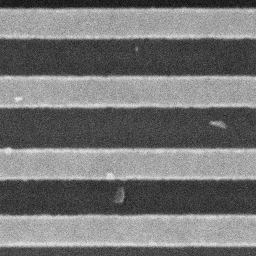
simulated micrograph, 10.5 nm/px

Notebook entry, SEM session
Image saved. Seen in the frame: lines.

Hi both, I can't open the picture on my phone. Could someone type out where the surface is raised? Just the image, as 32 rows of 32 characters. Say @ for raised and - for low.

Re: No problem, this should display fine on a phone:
--------------------------------
@@@@@@@@@@@@@@@@@@@@@@@@@@@@@@@@
@@@@@@@@@@@@@@@@@@@@@@@@@@@@@@@@
@@@@@@@@@@@@@@@@@@@@@@@@@@@@@@@@
@@@@@@@@@@@@@@@@@@@@@@@@@@@@@@@@
--------------------------------
--------------------------------
--------------------------------
--------------------------------
--------------------------------
@@@@@@@@@@@@@@@@@@@@@@@@@@@@@@@@
@@@@@@@@@@@@@@@@@@@@@@@@@@@@@@@@
@@@@@@@@@@@@@@@@@@@@@@@@@@@@@@@@
--------------------------------
--------------------------------
--------------------------------
--------------------------------
--------------------------------
--------------------------------
@@@@@@@@@@@@@@@@@@@@@@@@@@@@@@@@
@@@@@@@@@@@@@@@@@@@@@@@@@@@@@@@@
@@@@@@@@@@@@@@@@@@@@@@@@@@@@@@@@
--------------------------------
--------------------------------
--------------------------------
--------------------------------
--------------------------------
@@@@@@@@@@@@@@@@@@@@@@@@@@@@@@@@
@@@@@@@@@@@@@@@@@@@@@@@@@@@@@@@@
@@@@@@@@@@@@@@@@@@@@@@@@@@@@@@@@
@@@@@@@@@@@@@@@@@@@@@@@@@@@@@@@@
--------------------------------